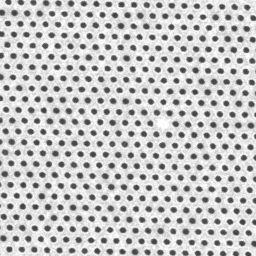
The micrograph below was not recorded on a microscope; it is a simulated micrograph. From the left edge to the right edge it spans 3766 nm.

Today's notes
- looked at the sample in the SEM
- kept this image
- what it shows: a regular array of holes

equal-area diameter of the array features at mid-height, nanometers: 102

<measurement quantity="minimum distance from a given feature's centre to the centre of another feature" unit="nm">179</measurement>